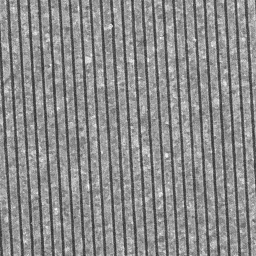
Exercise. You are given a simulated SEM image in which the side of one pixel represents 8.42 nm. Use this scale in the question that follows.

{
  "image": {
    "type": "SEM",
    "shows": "parallel lines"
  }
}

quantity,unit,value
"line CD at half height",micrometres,0.0578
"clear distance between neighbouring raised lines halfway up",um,0.0284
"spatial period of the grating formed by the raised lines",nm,87.1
